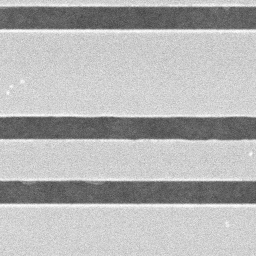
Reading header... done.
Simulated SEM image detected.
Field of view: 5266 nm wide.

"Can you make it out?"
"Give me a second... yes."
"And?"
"lines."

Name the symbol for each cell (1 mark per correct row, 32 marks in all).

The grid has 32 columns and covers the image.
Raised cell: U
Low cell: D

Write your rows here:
UUUUUUUUUUUUUUUUUUUUUUUUUUUUUUUU
DDDDDDDDDDDDDDDDDDDDDDDDDDDDDDDD
DDDDDDDDDDDDDDDDDDDDDDDDDDDDDDDD
DDDDDDDDDDDDDDDDDDDDDDDDDDDDDDDD
UUUUUUUUUUUUUUUUUUUUUUUUUUUUUUUU
UUUUUUUUUUUUUUUUUUUUUUUUUUUUUUUU
UUUUUUUUUUUUUUUUUUUUUUUUUUUUUUUU
UUUUUUUUUUUUUUUUUUUUUUUUUUUUUUUU
UUUUUUUUUUUUUUUUUUUUUUUUUUUUUUUU
UUUUUUUUUUUUUUUUUUUUUUUUUUUUUUUU
UUUUUUUUUUUUUUUUUUUUUUUUUUUUUUUU
UUUUUUUUUUUUUUUUUUUUUUUUUUUUUUUU
UUUUUUUUUUUUUUUUUUUUUUUUUUUUUUUU
UUUUUUUUUUUUUUUUUUUUUUUUUUUUUUUU
UUDDDDDUDUUUUDUUUUUUUUUUUUUUUDDU
DDDDDDDDDDDDDDDDDDDDDDDDDDDDDDDD
DDDDDDDDDDDDDDDDDDDDDDDDDDDDDDDD
DDDDDDDDDDDDDDDDDDDDDDDDDDDDDDDD
UUUUUUUUUUUUUUUUUUUUUUUUUUUUUUUU
UUUUUUUUUUUUUUUUUUUUUUUUUUUUUUUU
UUUUUUUUUUUUUUUUUUUUUUUUUUUUUUUU
UUUUUUUUUUUUUUUUUUUUUUUUUUUUUUUU
UUUUUUUUUUUUUUUUUUUUUUUUUUUUUUUU
DDDDDDDDDDDDDDDDDDDDDDDDDDDDDDDD
DDDDDDDDDDDDDDDDDDDDDDDDDDDDDDDD
DDDDDDDDDDDDDDDDDDDDDDDDDDDDDDDD
UUUUUUUUUUUUUUUUUUUUUUUUUUUUUUUU
UUUUUUUUUUUUUUUUUUUUUUUUUUUUUUUU
UUUUUUUUUUUUUUUUUUUUUUUUUUUUUUUU
UUUUUUUUUUUUUUUUUUUUUUUUUUUUUUUU
UUUUUUUUUUUUUUUUUUUUUUUUUUUUUUUU
UUUUUUUUUUUUUUUUUUUUUUUUUUUUUUUU